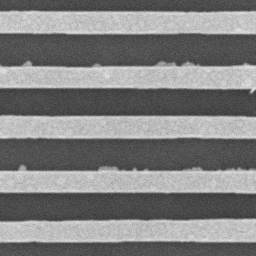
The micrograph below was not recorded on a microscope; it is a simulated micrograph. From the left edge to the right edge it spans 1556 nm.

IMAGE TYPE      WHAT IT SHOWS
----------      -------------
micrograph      lines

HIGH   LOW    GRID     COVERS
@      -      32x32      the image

--------------------------------
---@@---------------------------
@@@@@@@@@@@@@@@@@@@@@@@@@@@@@@@@
@@@@@@@@@@@@@@@@@@@@@@@@@@@@@@@@
--------------------------------
--------------------------------
--------------------------------
--------------------------------
@@@@@@@@----@@@@@@@@@@@@@@@@@@@@
@@@@@@@@@@@@@@@@@@@@@@@@@@@@@@@@
@@@@@@@@@@@@@@@@@@@@@@@@@@@@@@@@
--------------------------------
--------------------------------
--------------------------------
@@------------------------------
@@@@@@@@@@@@@@@@@@@@@@@@@@@@@@@@
@@@@@@@@@@@@@@@@@@@@@@@@@@@@@@@@
--------------------------------
--------------------------------
--------------------------------
--------------------------------
@@@@@@@@@@@@@@@@@@@@@@@@@@@@@@@@
@@@@@@@@@@@@@@@@@@@@@@@@@@@@@@@@
@@@@@@@@@@@@@@@@@@@@@@@@@@@@@@@@
--------------------------------
--------------------------------
--------------------------------
--------------------------@@@@@@
@@@@@@@@@@@@@@@@@@@@@@@@@@@@@@@@
@@@@@@@@@@@@@@@@@@@@@@@@@@@@@@@@
--------------------------------
--------------------------------